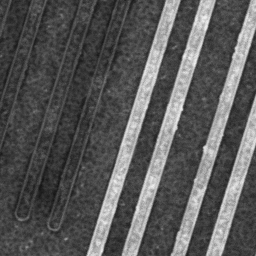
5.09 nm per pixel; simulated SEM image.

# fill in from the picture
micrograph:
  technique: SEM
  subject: parallel lines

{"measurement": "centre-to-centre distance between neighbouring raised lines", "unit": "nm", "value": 204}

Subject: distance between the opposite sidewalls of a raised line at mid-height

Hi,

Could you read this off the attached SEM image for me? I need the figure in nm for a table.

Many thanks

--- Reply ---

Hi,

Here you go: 65